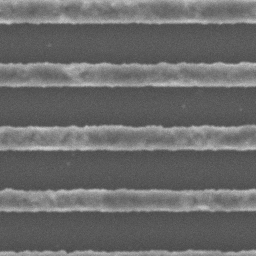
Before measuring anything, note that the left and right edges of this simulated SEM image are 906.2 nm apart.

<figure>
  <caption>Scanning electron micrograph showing lines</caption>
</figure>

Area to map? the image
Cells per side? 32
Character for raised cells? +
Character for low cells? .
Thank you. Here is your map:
++++++++++++++++++++++++++++++++
++++++++++++++++++++++++++++++++
++++++++++++++++++++++++++++++++
................................
................................
................................
................................
................................
++++++++++++++++++++++++++++++++
++++++++++++++++++++++++++++++++
++++++++++++++++++++++++++++++++
................................
................................
................................
................................
................................
++++++++++++++++++++++++++++++++
++++++++++++++++++++++++++++++++
++++++++++++++++++++++++++++++++
................................
................................
................................
................................
................................
++++++++++++++++++++++++++++++++
++++++++++++++++++++++++++++++++
................................
................................
................................
................................
................................
...+...+..++......+++..+++++..++